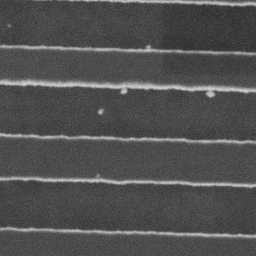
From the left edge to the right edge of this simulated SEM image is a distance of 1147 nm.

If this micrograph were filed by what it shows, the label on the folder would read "lines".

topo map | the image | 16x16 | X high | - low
----------------
----------------
----------------
XXXXXXXXXXXXXXXX
XXXXXXXXXXXXXXXX
-----------XXXXX
----------------
----------------
XXX-------------
XXXXXXXXXXXXXXXX
XXXXXXXXXXXXXXXX
------------XXXX
----------------
----------------
XXXXXXXX--------
XXXXXXXXXXXXXXXX